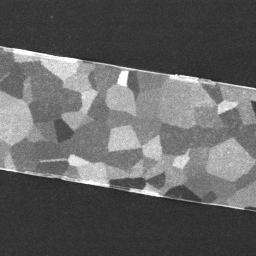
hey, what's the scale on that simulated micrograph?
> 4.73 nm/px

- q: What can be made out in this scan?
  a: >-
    one or a few lines or trenches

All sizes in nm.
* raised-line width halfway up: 575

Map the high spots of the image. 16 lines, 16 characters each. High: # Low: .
................
................
................
###.............
#########.......
################
################
################
################
################
################
......##########
...........#####
................
................
................